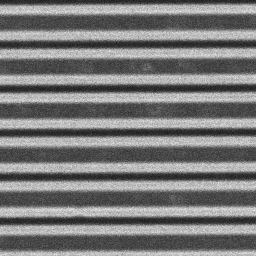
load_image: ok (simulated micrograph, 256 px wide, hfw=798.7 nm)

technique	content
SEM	parallel lines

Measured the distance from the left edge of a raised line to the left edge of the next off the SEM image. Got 0.0688 microns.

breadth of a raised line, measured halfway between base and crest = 29.3 nm